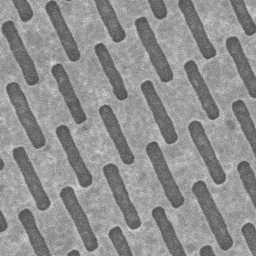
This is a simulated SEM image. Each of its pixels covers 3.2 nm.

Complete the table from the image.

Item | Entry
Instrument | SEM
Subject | a regular array of holes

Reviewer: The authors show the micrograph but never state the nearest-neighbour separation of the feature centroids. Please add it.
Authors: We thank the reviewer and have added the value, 154 nanometers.